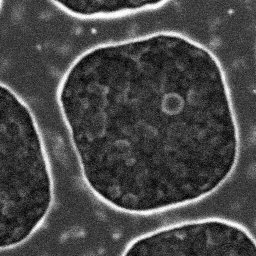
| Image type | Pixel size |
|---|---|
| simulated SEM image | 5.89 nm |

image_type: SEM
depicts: holes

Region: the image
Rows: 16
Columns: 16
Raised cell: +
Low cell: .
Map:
++++.....+++++++
++++++++++++++++
+++++++++...++++
+++++........+++
++++..........++
++++..........++
.+++..........++
..++...........+
..+++..........+
...++..........+
...++.........++
...+++........++
...++++.....++++
...+++++++++++++
..++++++++.....+
++++++++........